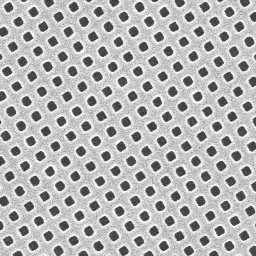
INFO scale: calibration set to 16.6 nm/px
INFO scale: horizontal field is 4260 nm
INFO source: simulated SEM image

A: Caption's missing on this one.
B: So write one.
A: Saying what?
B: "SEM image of a regular array of holes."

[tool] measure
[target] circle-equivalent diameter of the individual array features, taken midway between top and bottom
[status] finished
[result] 170 nm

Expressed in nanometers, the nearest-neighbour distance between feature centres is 294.